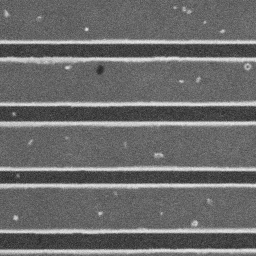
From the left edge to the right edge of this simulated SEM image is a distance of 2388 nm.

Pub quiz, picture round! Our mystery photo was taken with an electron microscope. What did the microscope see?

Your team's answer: lines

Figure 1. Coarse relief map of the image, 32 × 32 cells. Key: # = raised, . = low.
################################
################################
################################
################################
################################
................................
................................
###......#######################
################################
################################
################################
################################
################################
................................
................................
.....########.....######.#######
################################
################################
################################
################################
################################
................................
................................
################################
################################
################################
################################
################################
################################
................................
................................
################################